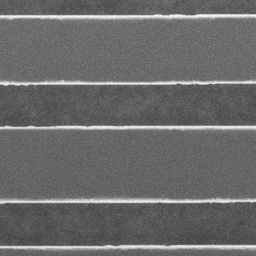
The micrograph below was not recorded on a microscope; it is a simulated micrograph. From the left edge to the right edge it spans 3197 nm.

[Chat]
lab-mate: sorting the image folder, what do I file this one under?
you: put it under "lines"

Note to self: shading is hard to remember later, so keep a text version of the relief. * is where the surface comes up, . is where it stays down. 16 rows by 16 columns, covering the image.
................
****************
****************
****************
****************
................
................
................
****************
****************
****************
****************
****************
................
................
****************